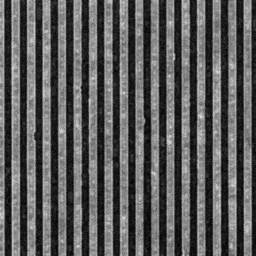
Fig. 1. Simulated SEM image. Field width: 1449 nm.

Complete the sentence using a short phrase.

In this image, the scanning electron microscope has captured parallel lines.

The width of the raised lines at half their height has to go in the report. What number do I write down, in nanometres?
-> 38.2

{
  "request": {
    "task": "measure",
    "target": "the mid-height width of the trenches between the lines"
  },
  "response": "47.4 nanometers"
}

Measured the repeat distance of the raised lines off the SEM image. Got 87.5 nm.